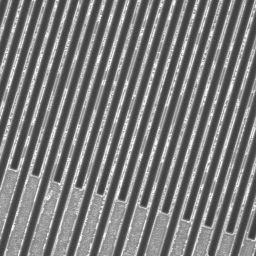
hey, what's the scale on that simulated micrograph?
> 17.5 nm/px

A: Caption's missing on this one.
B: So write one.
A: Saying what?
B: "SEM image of parallel lines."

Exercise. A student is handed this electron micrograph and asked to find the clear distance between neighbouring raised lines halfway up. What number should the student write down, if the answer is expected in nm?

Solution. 120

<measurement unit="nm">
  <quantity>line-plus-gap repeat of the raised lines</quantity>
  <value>197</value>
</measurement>